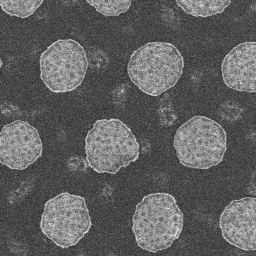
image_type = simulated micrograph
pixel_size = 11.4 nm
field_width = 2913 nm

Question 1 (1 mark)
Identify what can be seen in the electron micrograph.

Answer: raised bodies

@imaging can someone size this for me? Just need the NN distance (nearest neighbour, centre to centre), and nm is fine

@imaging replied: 999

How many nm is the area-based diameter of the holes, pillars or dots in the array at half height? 593